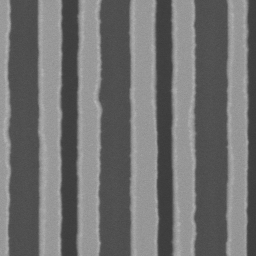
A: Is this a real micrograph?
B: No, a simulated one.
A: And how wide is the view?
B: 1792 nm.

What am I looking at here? lines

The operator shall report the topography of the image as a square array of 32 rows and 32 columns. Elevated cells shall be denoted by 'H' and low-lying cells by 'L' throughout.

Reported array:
HLLLLHHHLLHHHLLLHHHHLHHHLLLLLHHL
HLLLLHHHLLHHLLLLHHHLLHHHLLLLLHHL
HLLLLHHHLLHHLLLLHHHLLHHHLLLLLHHL
HLLLLHHHLLHHLLLLHHHLLHHHLLLLLHHL
HLLLLHHHLLHHHLLLHHHLLHHHLLLLLHHL
HLLLLHHHLLHHHLLLHHHLLHHHLLLLLHHL
HLLLLHHHLLHHHLLLHHHLLHHHLLLLLHHL
HLLLLHHHLLHHHLLLHHHLLHHHLLLLHHHL
HLLLLHHHLLHHHLLLHHHLLLHHLLLLLHHL
HLLLLHHHLLHHHLLLHHHLLHHHLLLLHHHL
HLLLLHHHLLHHHLLLHHHLLHHHLLLLLHHL
HLLLLHHHLLHHLLLLHHHLLHHHLLLLLHHL
HLLLLHHHLLHHLLLLHHHLLHHHLLLLHHHL
HLLLLHHHLLHHHLLLHHHHLHHHLLLLHHHL
HLLLLHHHLLHHHLLLHHHHLLHHLLLLHHHL
HLLLLHHHLLHHHLLLHHHHLHHHLLLLHHHL
HLLLLHHHLLHHHLLLHHHHLHHHLLLLLHHL
HLLLLHHHLLHHHLLLHHHHLHHHLLLLLHHL
HLLLLHHHLLHHHLLLHHHHLHHHLLLLLHHL
HLLLLHHHLLHHLLLLHHHHLHHHLLLLLHHL
HLLLLHHHLLHHHLLLHHHHLHHHLLLLLHHL
HLLLLHHHLLHHLLLLHHHHLLHHLLLLLHHL
HLLLLHHHLLHHLLLLHHHHLLHHLLLLLHHL
HLLLLHHHLLHHLLLLHHHHLLHHLLLLHHHL
HLLLLHHHLLHHLLLLHHHHLLHHLLLLHHHL
HLLLLHHHLLHHLLLLHHHHLLHHLLLLHHHL
HLLLLHHHLLHHLLLLHHHHLLHHLLLLHHHL
HLLLLHHHLLHHLLLLHHHHLLHHLLLLHHHL
HLLLLHHHLLHHLLLLHHHHLLHHLLLLHHHL
HLLLLHHHLLHHLLLLHHHHLLHHLLLLHHHL
HLLLLHHHLLHHHLLLHHHHLLHHLLLLHHHL
HLLLLHHHLLHHLLLLLHHHLLHHLLLLHHHL